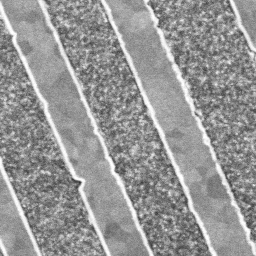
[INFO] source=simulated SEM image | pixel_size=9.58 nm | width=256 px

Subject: one or a few lines or trenches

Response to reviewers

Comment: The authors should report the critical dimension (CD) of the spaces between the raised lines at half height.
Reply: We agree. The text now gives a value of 552 nm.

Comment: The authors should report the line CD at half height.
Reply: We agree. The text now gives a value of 379 nanometers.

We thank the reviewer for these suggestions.